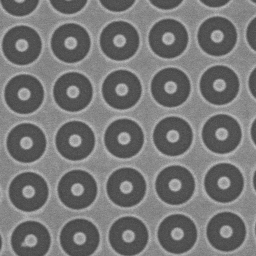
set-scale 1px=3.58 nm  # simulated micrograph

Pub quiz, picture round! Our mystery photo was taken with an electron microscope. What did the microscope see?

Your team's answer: an array of small figures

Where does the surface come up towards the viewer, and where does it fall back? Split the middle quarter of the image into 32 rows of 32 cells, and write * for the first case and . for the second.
********************************
*************...********.....***
.....******.......*****........*
......****.........***.........*
.......***.........***..........
.......**....***...**....***....
.***....*....***....*....***....
.**....**.....*.....**..........
.......***.........***.........*
.......***.........****.......**
......*****.......******.....***
.....********..*****************
********************************
**************..*********....***
*....*******......******.......*
......*****........****.........
.......***..........**..........
........**....**....**....***...
.***....**....**....**....**....
..**....**....**....**..........
..*.....**..........***.........
.......****........****........*
.......*****.......*****......**
......*******....***************
**.*****************************
**************************....**
**...********.....******.......*
.......*****.......****.........
........***.........***.........
........***..........**....**...
..**....**....***....**...***...
..***....*....***....**....*....